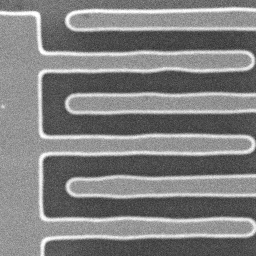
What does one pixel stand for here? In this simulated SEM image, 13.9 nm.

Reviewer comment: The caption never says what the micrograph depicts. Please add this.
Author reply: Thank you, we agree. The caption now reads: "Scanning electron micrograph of groups of lines, slits or small figures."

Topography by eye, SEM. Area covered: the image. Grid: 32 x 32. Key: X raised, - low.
--------------------------------
----------XXXXXXXXXXXXXXXXXXXXXX
XXXXX---XXXXXXXXXXXXXXXXXXXXXXXX
XXXXX----XXXXXXXXXXXXXXXXXXXXXXX
XXXXX---------------------------
XXXXX---------------------------
XXXXXX----------------------XXX-
XXXXXXXXXXXXXXXXXXXXXXXXXXXXXXXX
XXXXXXXXXXXXXXXXXXXXXXXXXXXXXXX-
XXXXX---------------------------
XXXXX---------------------------
XXXXX---------------------------
XXXXX---XXXXXXXXXXXXXXXXXXXXXXXX
XXXXX---XXXXXXXXXXXXXXXXXXXXXXXX
XXXXX---------------------------
XXXXX---------------------------
XXXXX---------------------------
XXXXXXXXXXXXXXXXXXXXXXXXXXXXXXXX
XXXXXXXXXXXXXXXXXXXXXXXXXXXXXXXX
XXXXXX--------------------------
XXXXX---------------------------
XXXXX---------------------------
XXXXX----XXXXXXXXXXXXXXXXXXXXXXX
XXXXX---XXXXXXXXXXXXXXXXXXXXXXXX
XXXXX-------XXXXXX--------------
XXXXX---------------------------
XXXXX---------------------------
XXXXXXXXXXXXXXXXXXXXX----XXXXXX-
XXXXXXXXXXXXXXXXXXXXXXXXXXXXXXXX
XXXXXXXXXXXXXXXXXXXXXXXXXXXXXXX-
XXXXX---------------------------
XXXXX---------------------------